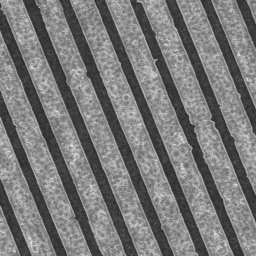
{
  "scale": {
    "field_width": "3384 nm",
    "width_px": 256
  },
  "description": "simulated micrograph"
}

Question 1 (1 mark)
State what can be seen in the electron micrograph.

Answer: parallel lines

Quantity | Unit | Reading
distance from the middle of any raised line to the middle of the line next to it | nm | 434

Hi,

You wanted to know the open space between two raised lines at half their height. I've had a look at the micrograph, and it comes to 151 nm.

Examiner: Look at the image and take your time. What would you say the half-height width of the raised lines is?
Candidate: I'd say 282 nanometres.